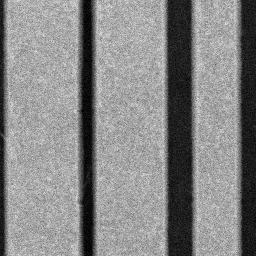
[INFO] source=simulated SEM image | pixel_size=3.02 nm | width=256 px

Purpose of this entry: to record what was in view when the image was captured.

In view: one or a few lines or trenches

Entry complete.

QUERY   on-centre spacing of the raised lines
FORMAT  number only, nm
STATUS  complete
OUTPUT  261